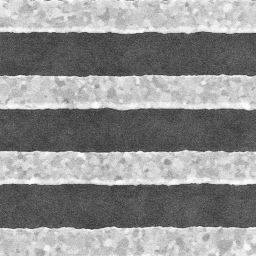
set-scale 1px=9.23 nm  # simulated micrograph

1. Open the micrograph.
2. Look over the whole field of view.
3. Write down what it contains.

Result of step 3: lines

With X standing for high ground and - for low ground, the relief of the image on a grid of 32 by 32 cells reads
XXXXXXXXXXXXXXXXXXXXXXXXXXXXXXXX
XXXXXXXXXXXXXXXXXXXXXXXXXXXXXXXX
XXXXXXXXXXXXXXXXXXXXXXXXXXXXXXXX
XXXXXXXXXXXXXXXXXXXXXXXXXXXXXXXX
--------------------------------
--------------------------------
--------------------------------
--------------------------------
--------------------------------
X-XXX------X----X-XXX-XXXXXXXXX-
XXXXXXXXXXXXXXXXXXXXXXXXXXXXXXXX
XXXXXXXXXXXXXXXXXXXXXXXXXXXXXXXX
XXXXXXXXXXXXXXXXXXXXXXXXXXXXXXXX
X-------------XXX------XX-----XX
--------------------------------
--------------------------------
--------------------------------
--------------------------------
--------------------------------
XXXXXXXXXXXXXXXXXXXXXXXXXXXXXXXX
XXXXXXXXXXXXXXXXXXXXXXXXXXXXXXXX
XXXXXXXXXXXXXXXXXXXXXXXXXXXXXXXX
XXXXXXXXXXXXXXXXXXXXXXXXXXXXXXXX
--------------------------------
--------------------------------
--------------------------------
--------------------------------
--------------------------------
-----X--X----XX-XXXXXX-XXXXXXX-X
XXXXXXXXXXXXXXXXXXXXXXXXXXXXXXXX
XXXXXXXXXXXXXXXXXXXXXXXXXXXXXXXX
XXXXXXXXXXXXXXXXXXXXXXXXXXXXXXXX